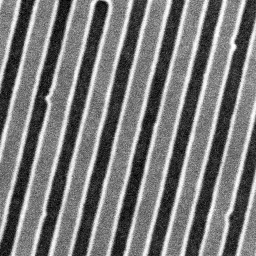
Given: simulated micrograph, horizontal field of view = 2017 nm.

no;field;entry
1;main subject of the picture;parallel lines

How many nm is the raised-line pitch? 287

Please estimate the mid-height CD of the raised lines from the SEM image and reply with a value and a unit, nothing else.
163 nm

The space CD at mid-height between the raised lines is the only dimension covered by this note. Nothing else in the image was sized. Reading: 128 nanometres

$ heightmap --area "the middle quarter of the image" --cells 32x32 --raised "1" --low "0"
11110000111110000111111000011111
11100000111110000111110000111111
11100001111110000111110000111110
11100001111100000111110000111110
11100001111100001111110000111110
11000001111100001111100001111110
11000001111100001111100001111100
11000011111000001111100001111100
11000011111000011111100001111100
11000011111000011111000001111100
10000011111000011111000011111000
10000111110000011111000011111000
10000111110000111111000011111000
10000111110000111110000111111000
00000111110000111110000111110000
00001111100000111110000111110000
00001111100001111110000111110000
00001111100001111100001111110000
00001111100001111100001111100000
00011111000001111100001111100000
00011111000011111100001111100001
00011111000011111000011111100001
00011111000011111000011111100001
00111111000011111000011111000001
00111110000111111000011111000011
00111110000111110000011111000011
00111110000111110000111111000011
01111100000111110000111110000111
01111100000111110000111110000111
01111100001111110000111110000111
01111100001111100000111110000111
11111100001111100001111100000111